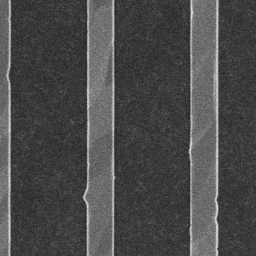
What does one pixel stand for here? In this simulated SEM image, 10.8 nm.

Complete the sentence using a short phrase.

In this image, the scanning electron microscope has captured one or a few lines or trenches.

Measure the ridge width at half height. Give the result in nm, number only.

279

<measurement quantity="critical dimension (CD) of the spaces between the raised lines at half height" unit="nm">837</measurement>